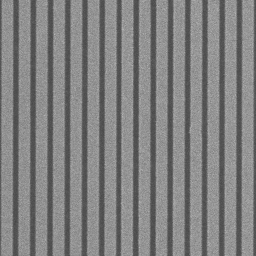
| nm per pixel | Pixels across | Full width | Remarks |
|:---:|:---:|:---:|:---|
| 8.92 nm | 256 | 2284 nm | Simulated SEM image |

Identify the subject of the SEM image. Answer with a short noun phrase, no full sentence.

parallel lines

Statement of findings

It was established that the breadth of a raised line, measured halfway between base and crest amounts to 101 nm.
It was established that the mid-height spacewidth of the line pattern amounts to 49 nm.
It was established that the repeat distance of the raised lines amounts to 153 nm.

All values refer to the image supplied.